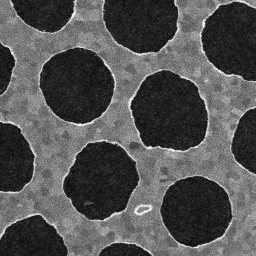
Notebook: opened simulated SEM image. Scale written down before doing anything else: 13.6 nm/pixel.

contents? holes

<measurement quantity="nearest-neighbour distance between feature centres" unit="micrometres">1.31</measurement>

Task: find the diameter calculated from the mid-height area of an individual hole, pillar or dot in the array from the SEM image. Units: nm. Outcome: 1020